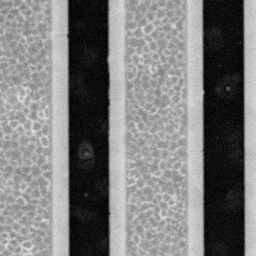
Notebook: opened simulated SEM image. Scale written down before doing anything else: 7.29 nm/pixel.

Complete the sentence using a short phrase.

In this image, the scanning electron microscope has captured one or a few lines or trenches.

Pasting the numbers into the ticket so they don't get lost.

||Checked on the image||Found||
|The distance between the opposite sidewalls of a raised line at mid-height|0.571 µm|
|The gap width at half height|56.4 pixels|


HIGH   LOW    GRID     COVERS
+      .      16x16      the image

++++...+++++....
++++...+++++....
++++...+++++....
++++...+++++....
++++...+++++....
++++...+++++....
++++...+++++....
++++...+++++....
++++...+++++....
++++...+++++....
++++...+++++....
++++...+++++....
++++...+++++....
++++...+++++....
++++...+++++....
++++...+++++....